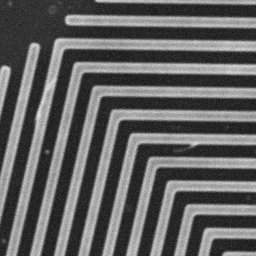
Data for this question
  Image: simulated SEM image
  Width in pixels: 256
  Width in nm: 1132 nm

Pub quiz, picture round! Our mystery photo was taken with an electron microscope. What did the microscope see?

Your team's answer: groups of lines, slits or small figures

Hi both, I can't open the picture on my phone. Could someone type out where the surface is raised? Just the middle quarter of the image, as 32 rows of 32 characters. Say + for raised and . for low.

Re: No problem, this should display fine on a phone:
..++++++++++++++++++++++++++++++
..++++++++++++++++++++++++++++++
..+++...........................
..++............................
..++............................
.+++............................
.+++...+++++++++++++++++++++++++
.++....+++++++++++++++++++++++++
.++....++.......................
+++...+++.......................
+++...+++.......................
++....++........................
++....++....++++++++++++++++++++
++...+++....++++++++++++++++++++
++...+++...+++..................
+....++....++...................
+....++....++...................
+...+++...+++....+++++++++......
+...+++...+++...++++++++++++++++
+...+++...++....++++++++++++++++
....++....++....++..............
....++....++....++..............
...+++...+++...+++..............
...+++...+++...+++...+++++++++++
...++....++....++....+++++++++++
...++....++....++....+++++++++++
..+++....++....++....++.........
..+++...+++...+++...+++.........
..++....++....++....+++.........
..++....++....++....++....++++++
..++...+++....++....++....++++++
.+++...+++...+++...+++...+++++++